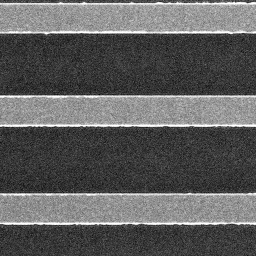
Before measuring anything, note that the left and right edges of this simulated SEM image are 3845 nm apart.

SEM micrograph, lines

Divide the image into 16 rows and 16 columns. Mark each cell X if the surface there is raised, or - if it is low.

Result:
XXXXXXXXXXXXXXXX
XXXXXXXXXXXXXXXX
----------------
----------------
----------------
----------------
XXXXXXXXXXXXXXXX
XXXXXXXXXXXXXXXX
----------------
----------------
----------------
----------------
XXXXXXXXXXXXXXXX
XXXXXXXXXXXXXXXX
----------------
----------------